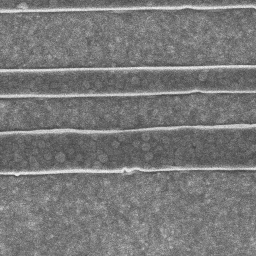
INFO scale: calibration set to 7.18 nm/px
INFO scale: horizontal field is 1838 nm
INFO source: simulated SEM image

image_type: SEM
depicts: one or a few lines or trenches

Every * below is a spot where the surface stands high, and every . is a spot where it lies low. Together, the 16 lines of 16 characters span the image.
***********.**..
................
................
................
****************
****************
................
................
****************
****************
****************
................
................
................
................
................